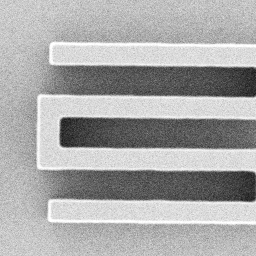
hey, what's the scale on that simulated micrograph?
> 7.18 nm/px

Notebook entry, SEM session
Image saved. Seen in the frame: groups of lines, slits or small figures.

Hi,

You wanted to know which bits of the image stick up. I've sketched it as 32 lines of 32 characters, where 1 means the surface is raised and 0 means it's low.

00000000000000000000000000000000
00000000000000000000000000000000
00000000000000000000000000000000
00000000000000000000000000000000
00000000000000000000000000000000
00000001111110000000000000000000
00000011111111111111111111111111
00000011111111111111111111111111
00000000000000000000000000000000
00000000000000000000000000000000
00000000000000000000000000000000
00000000000000000000000000000000
00000111111111111111111111111111
00000111111111111111111111111111
00000111111111111111111111111111
00000110000000000000000000000000
00000110000000000000000000000000
00000110000000000000000000000000
00000111000000000000000000000000
00000111111111111111111111111111
00000111111111111111111111111111
00000000000000000000000000000000
00000000000000000000000000000000
00000000000000000000000000000000
00000000000000000000000000000000
00000011111111111111111111111111
00000011111111111111111111111111
00000011111111111111111111111111
00000000000000000000000000000000
00000000000000000000000000000000
00000000000000000000000000000000
00000000000000000000000000000000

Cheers